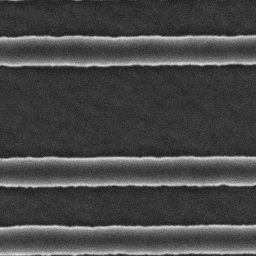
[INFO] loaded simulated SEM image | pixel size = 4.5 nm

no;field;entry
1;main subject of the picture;lines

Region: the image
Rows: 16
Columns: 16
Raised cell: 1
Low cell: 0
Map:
0000000000000000
0000000000000000
1111111111111111
1111111111111111
0000000000000000
0000000000000000
0000000000000000
0000000000000000
0000000000000000
0000000000000000
1111111111111111
1111111111111111
0000000000000000
0000000000000000
1111111111111111
1111111111111111